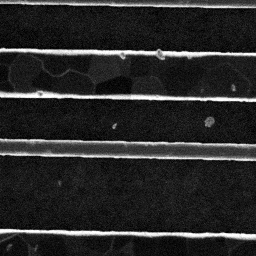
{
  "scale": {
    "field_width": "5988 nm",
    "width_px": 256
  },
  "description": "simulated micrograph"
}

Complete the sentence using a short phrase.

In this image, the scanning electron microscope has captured lines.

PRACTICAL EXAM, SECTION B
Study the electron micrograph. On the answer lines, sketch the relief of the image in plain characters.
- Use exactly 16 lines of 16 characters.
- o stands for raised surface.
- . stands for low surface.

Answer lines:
................
................
................
oooooooooooooooo
oooooooooooooooo
oooooooooooooooo
................
................
................
................
................
................
................
................
oooo............
oooooooooooooooo